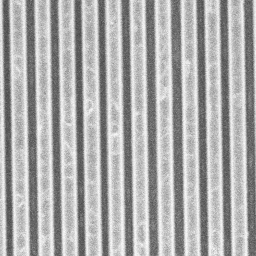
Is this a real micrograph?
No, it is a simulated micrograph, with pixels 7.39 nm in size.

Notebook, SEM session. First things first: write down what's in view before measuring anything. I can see parallel lines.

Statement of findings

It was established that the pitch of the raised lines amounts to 179 nm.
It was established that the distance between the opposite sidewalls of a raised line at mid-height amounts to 14.8 px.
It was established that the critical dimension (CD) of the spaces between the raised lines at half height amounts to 71.6 nm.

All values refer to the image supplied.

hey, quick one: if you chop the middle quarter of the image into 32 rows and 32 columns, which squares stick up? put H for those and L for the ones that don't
HHHLLHHHLLLHHHLLLHHHLLLHHHHLLLHH
HHHLLHHHLLLHHHLLLHHHLLLHHHHLLLHH
HHHLLHHHLLLHHHLLLHHHLLLHHHHLLLHH
HHHLLHHHLLLHHHLLLHHHLLLHHHHLLLHH
HHHLLHHHLLLHHHLLLHHHLLLHHHHLLLHH
HHHLLHHHLLLHHHLLLHHHLLLHHHHLLLHH
HHHLLHHHLLLHHHLLLHHHLLLHHHHLLLHH
HHHLLHHHLLLHHHLLLHHHLLLHHHHLLLHH
HHHLLHHHLLLHHHLLLHHHLLLHHHHLLLHH
HHHLLHHHLLLHHHLLLHHHLLLHHHHLLLHH
HHHLLHHHHLLHHHLLLHHHLLLHHHHLLLHH
HHHLLHHHHLLHHHLLLHHHLLLHHHHLLLHH
HHHLLHHHHLLHHHLLLHHHHLLLHHHLLLHH
HHHLLHHHHLLHHHLLLHHHHLLLHHHLLLHH
HHHLLHHHHLLHHHLLLHHHHLLLHHHLLLHH
HHHLLHHHHLLHHHLLLHHHHLLLHHHLLLHH
HHHLLHHHHLLHHHLLLHHHHLLLHHHLLLHH
HHHLLHHHHLLHHHLLLHHHHLLLHHHLLLHH
HHHLLHHHHLLHHHLLLHHHHLLLHHHLLLHH
HHHLLHHHHLLHHHLLLHHHHLLLHHHLLLHH
HHHLLHHHHLLHHHLLLHHHHLLLHHHLLLHH
HHHLLHHHHLLHHHLLLHHHHLLLHHHLLLHH
HHHLLHHHHLLHHHLLLHHHHLLLHHHLLLHH
HHHLLHHHHLLHHHLLLHHHHLLLHHHLLLHH
HHHLLHHHHLLHHHLLLHHHHLLLHHHLLLHH
HHHLLHHHHLLHHHLLLHHHHLLLHHHLLLHH
HHHLLHHHHLLHHHHLLHHHHLLLHHHLLLHH
HHHLLHHHHLLHHHHLLHHHHLLLHHHLLLHH
HHHLLHHHHLLHHHHLLHHHHLLLHHHLLLHH
HHHLLHHHHLLHHHHLLHHHHLLLHHHLLLHH
HHHLLHHHHLLHHHHLLHHHHLLLHHHLLLHH
HHHLLHHHHLLHHHHLLHHHHLLLHHHLLLHH